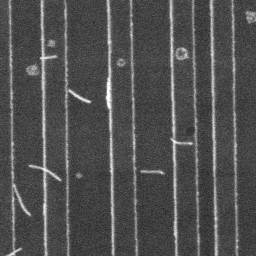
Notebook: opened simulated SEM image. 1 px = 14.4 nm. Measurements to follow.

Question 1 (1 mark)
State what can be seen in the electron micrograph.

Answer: lines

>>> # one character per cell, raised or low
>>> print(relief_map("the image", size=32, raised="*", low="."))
*....***.....***.....***..***...
*....***......**.....***..***...
*....***......**.....***..***...
*....***......**.....***..***...
*....***......**.....***..***...
*....***......**.....***...**...
*....***......**......**...**...
*....***......***.....**...**...
*....***......***.....**...**...
*....***......***.....**...**...
*....***......***.....**...**...
*....***.....****.....**...**...
*....***.....****.....**...**...
*....***......***.....**...**...
*....***......***.....***..**...
*....***......***.....***..**...
*.....**......***.....***..**...
**....**......***.....***..**...
**....**......***.....***..**...
**....**......***.....***..**...
**....**......***.....***..**...
**...***......***.....***..**...
**....**......***.....***..**...
**....**......***.....***..**...
**....**......***.....***..***..
**....**......***.....***..***..
**....***.....***.....***..***..
**....**......***.....***..***..
**....***.....***.....***..***..
**....***.....***.....***..***..
**....***.....***.....***..***..
**....***.....***.....***..***..